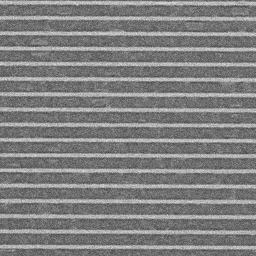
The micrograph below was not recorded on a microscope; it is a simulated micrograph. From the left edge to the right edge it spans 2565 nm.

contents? parallel lines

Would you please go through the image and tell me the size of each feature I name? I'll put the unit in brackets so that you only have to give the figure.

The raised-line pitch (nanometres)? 153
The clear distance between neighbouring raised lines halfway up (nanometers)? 118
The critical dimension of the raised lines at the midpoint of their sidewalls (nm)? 33.8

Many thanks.